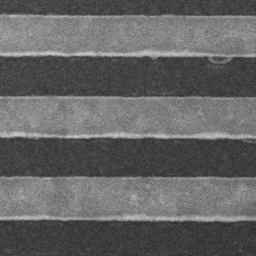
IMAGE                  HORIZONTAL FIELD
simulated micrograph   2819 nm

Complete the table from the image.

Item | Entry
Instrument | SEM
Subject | lines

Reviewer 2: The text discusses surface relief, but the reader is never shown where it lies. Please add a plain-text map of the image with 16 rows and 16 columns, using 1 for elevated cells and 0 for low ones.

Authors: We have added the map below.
0000000000000000
1111111111111111
1111111111111111
0000000110110111
0000000000000000
0000000000000000
1111111111111111
1111111111111111
1111111111111111
0000000000000000
0000000000000000
1111111111111111
1111111111111111
1111111111111111
0000000000000000
0000000000000000